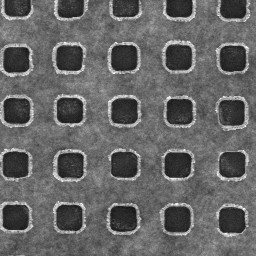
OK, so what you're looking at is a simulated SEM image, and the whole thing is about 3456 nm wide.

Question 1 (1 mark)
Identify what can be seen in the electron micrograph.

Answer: a regular array of holes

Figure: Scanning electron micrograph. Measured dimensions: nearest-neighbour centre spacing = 711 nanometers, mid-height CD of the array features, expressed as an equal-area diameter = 0.393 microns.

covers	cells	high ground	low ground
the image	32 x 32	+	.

....+++....+++...++++...+++....+
+...+++....+++...++++...+++....+
++++++++++++++++++++++++++++++++
++++++++++++++++++++++++++++++++
++++++++++++++++++++++++++++++++
+++++++++++++++++++++..+++++++++
....+++...++++...++++...+++....+
....+++...++++...++++...+++....+
....+++...++++...++++...++++...+
++++++++++++++++++++++++++++++++
++++++++++++++++++++++++++++++++
++++++++++++++++++++++++++++++++
+..++++...++++...++++...++++..++
....+++...++++...++++...+++....+
....+++...++++...++++...+++....+
++.+++++++++++...++++...++++..++
++++++++++++++++++++++++++++++++
++++++++++++++++++++++++++++++++
++++++++++++++++++++++++++++++++
....+++...++++...++++...++++...+
....+++....+++...+++....+++....+
....+++...++++...++++...+++....+
++++++++++++++++++++++++++++++++
++++++++++++++++++++++++++++++++
++++++++++++++++++++++++++++++++
++++++++++++++++++++++++++++++++
....+++...++++...++++...+++....+
....+++...++++...+++....+++....+
+..++++...++++...++++...+++....+
++++++++++++++++++++++++++++++++
++++++++++++++++++++++++++++++++
++++++++++++++++++++++++++++++++